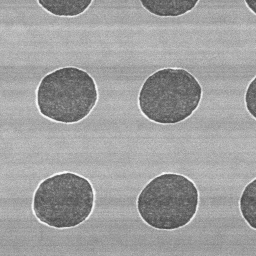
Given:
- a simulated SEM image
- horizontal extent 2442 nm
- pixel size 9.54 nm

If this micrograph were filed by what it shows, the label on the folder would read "holes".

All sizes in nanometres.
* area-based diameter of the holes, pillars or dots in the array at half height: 556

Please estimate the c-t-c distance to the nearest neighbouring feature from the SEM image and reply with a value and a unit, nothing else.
0.99 micrometres